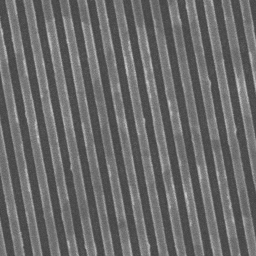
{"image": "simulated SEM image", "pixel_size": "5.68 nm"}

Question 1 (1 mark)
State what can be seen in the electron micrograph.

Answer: parallel lines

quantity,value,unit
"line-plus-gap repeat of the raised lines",17.7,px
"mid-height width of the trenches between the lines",47.5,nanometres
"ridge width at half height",0.0524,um